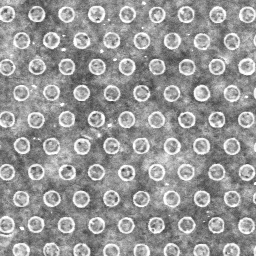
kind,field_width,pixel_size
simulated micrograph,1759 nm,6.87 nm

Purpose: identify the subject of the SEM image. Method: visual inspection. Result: a regular array of raised bodies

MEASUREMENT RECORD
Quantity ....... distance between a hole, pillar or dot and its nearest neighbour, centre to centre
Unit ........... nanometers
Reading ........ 204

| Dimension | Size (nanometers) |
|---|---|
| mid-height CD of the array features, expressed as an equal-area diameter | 104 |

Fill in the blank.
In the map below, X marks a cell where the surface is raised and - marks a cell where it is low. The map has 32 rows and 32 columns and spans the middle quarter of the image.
XX----XXXX----XXX-----XXX----XXX
XX-----XXX----XXX-----XXX----XXX
X--------------X----------------
--------------------------------
--------------------------------
--------------------------------
---XXX-----XXX----XXX----XXX----
---XXX----XXXX----XXX----XXXX---
---XXX-----XX-----XXX-----XX----
--------------------------------
--------------------------------
--------------------------------
XX-----XX------XX-----XX------XX
XX----XXXX----XXX-----XXX----XXX
XX----XXXX----XXX----XXXX----XXX
X------XX------XX-----XX------XX
--------------------------------
--------------------------------
--------------------------------
---XXX----XXX-----XXX-----XX----
---XXX----XXXX---XXXX----XXXX---
---XXX----XXX-----XXX----XXXX---
--------------------------------
--------------------------------
--------------------------------
XX-----XX-------------XX------X-
XXX---XXXX----XXX----XXXX----XXX
XXX---XXXX----XXX----XXXX----XXX
XX-----XX-----XXX-----XX------XX
--------------------------------
--------------------------------
--------------------------------